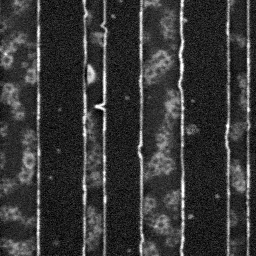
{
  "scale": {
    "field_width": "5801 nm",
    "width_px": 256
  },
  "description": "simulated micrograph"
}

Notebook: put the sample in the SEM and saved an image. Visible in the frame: one or a few lines or trenches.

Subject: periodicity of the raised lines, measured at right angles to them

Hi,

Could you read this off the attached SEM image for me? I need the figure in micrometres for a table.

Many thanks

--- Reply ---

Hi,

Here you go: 1.62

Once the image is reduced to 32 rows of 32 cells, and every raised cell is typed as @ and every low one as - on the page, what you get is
-----@@@@@@--@@@@@-----@@@@@@--@
-----@@@@@@--@@@@@-----@@@@@@--@
-----@@@@@@--@@@@@-----@@@@@@--@
-----@@@@@@--@@@@@-----@@@@@@--@
-----@@@@@@--@@@@@-----@@@@@@--@
-----@@@@@@--@@@@@-----@@@@@@--@
-----@@@@@@--@@@@@-----@@@@@@--@
-----@@@@@@--@@@@@-----@@@@@@--@
-----@@@@@@--@@@@@-----@@@@@@--@
-----@@@@@@@-@@@@@-----@@@@@@--@
-----@@@@@@--@@@@@----@@@@@@@--@
-----@@@@@@--@@@@@-----@@@@@@--@
-----@@@@@@--@@@@@-----@@@@@@--@
-----@@@@@@--@@@@@-----@@@@@@--@
-----@@@@@@--@@@@@-----@@@@@@--@
-----@@@@@@--@@@@@-----@@@@@@--@
-----@@@@@@--@@@@@-----@@@@@---@
-----@@@@@@--@@@@@-----@@@@@---@
-----@@@@@@--@@@@------@@@@@@--@
-----@@@@@@--@@@@@-----@@@@@@--@
---@-@@@@@@--@@@@@-----@@@@@@--@
-----@@@@@@--@@@@@-----@@@@@@--@
-----@@@@@@--@@@@@-----@@@@@@--@
-----@@@@@@--@@@@@-----@@@@@@--@
-----@@@@@@--@@@@@-----@@@@@@--@
-----@@@@@@--@@@@@-----@@@@@@--@
-----@@@@@@--@@@@@-----@@@@@@--@
-----@@@@@@--@@@@@-----@@@@@@--@
-----@@@@@@--@@@@@-----@@@@@@--@
-----@@@@@@--@@@@@-----@@@@@@--@
-----@@@@@@--@@@@@-----@@@@@@--@
-----@@@@@@--@@@@@-----@@@@@@--@